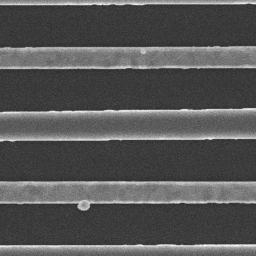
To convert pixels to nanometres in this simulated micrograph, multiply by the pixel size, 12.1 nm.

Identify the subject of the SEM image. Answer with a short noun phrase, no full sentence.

lines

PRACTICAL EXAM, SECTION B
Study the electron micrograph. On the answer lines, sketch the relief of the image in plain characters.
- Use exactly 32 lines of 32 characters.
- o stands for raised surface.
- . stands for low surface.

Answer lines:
oooooooooooooooooo..............
................................
................................
................................
................................
................................
oooooooooooooooooooooooooooooooo
oooooooooooooooooooooooooooooooo
.oo.............................
................................
................................
................................
................................
................................
oooooooooooooooooooooooooooooooo
oooooooooooooooooooooooooooooooo
oooooooooooooooooooooooooooooooo
oooooooooooooo..................
................................
................................
................................
................................
................................
oooooooooooooooooooooooooooooooo
oooooooooooooooooooooooooooooooo
.........ooo....................
................................
................................
................................
................................
................................
oooooooooooooooooooooooooooooooo